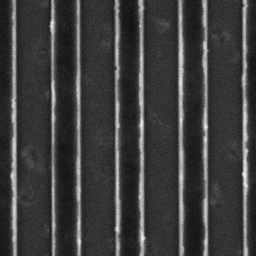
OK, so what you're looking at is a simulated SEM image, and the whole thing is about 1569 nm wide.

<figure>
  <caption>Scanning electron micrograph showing one or a few lines or trenches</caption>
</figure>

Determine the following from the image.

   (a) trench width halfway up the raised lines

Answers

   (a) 226 nm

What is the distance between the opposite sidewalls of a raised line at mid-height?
160 nm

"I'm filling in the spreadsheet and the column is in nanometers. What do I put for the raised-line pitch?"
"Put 391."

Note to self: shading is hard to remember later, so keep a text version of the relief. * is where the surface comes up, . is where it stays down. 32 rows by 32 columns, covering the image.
**....****....****.....***.....*
**....****....****.....***.....*
**....****.....***.....***.....*
**....****.....***.....***.....*
**....****.....***.....***.....*
**....****.....***.....***.....*
**....****.....***.....***.....*
**.....***.....***.....***.....*
**.....***.....***.....***.....*
**.....***.....***.....***....**
**.....***.....***.....***....**
**.....***.....***.....***.....*
**.....***.....***.....***.....*
**.....***.....***.....***.....*
**.....***.....***....****.....*
**.....***.....***....****.....*
**.....***.....***.....***.....*
**.....***.....***.....***.....*
**.....***.....***.....***.....*
**.....***.....***.....***.....*
**.....***.....***.....***....**
**.....***.....***....****....**
**.....***.....***....****....**
**.....***.....***.....***....**
**.....***.....***.....***.....*
**.....***.....***.....***.....*
**.....***.....***.....***.....*
**.....***.....***.....***.....*
**.....***....****.....***.....*
**.....***.....***.....***.....*
**.....***.....***.....***.....*
**.....***.....***.....***.....*